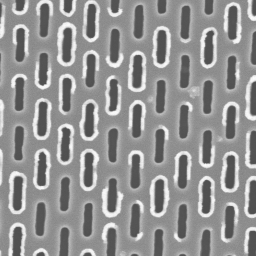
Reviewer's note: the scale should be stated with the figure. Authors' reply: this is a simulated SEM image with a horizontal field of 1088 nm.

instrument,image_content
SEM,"a regular array of holes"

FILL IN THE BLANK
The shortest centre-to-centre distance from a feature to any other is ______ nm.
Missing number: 144